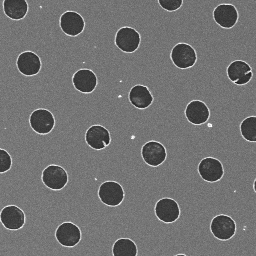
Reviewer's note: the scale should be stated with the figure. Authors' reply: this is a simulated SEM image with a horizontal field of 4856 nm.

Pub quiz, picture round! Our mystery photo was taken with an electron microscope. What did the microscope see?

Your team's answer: a regular array of holes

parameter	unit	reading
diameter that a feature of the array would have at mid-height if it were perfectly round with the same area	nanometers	454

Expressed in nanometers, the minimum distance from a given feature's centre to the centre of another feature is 1110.